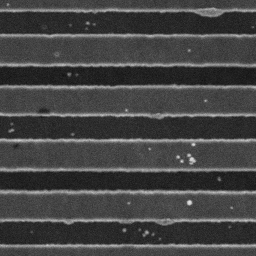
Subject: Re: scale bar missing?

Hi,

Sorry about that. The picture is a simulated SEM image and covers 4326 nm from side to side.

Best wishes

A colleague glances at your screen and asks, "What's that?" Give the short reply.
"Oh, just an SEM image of lines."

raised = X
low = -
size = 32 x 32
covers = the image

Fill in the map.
XXXXXXXXXXXXXXXXXXXXXXXXXXXXXXXX
---------X-X------------XXXX----
--------------------------------
--------------------------------
XXXXXXXXXXXXXXXXXXXXXXXXXXXXXXXX
XXXXXXXXXXXXXXXXXXXXXXXXXXXXXXXX
XXXXXXXXXXXXXXXXXXXXXXXXXXXXXXXX
XXXXXXXXXXXXXXXXXXXXXXXXXXXXXXXX
--------------------------------
--------------------------------
--------------------------------
XXXXXXXXXXXXXXXXXXXXXXXXXXXXXXXX
XXXXXXXXXXXXXXXXXXXXXXXXXXXXXXXX
XXXXXXXXXXXXXXXXXXXXXXXXXXXXXXXX
------------------XXX-----------
--------------------------------
--------------------------------
XXXXXXXXXXXX-XXXXXX-XXXXXXXXXXXX
XXXXXXXXXXXXXXXXXXXXXXXXXXXXXXXX
XXXXXXXXXXXXXXXXXXXXXXXXXXXXXXXX
XXXXXXXXXXXXXXXXXXXXXXXXXXXXXXXX
--------------------------------
--------------------------------
--------------------------------
XXXXXXXXXXXXXXXXXXXXXXXXXXXXXXXX
XXXXXXXXXXXXXXXXXXXXXXXXXXXXXXXX
XXXXXXXXXXXXXXXXXXXXXXXXXXXXXXXX
XXXXXXXXXXXXXXXXXXXXXXXXXXXXXXXX
--------------------------------
--------------------------------
--------------------------------
XXXXXXXXXXXXXXXXXXXXXXXXXXXXXXXX